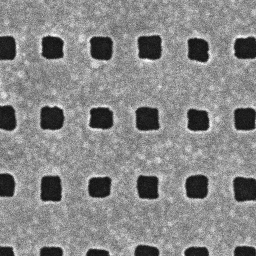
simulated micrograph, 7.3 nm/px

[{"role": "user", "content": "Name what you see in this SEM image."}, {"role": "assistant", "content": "a regular array of holes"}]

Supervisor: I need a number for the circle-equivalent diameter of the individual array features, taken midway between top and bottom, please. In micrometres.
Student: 0.183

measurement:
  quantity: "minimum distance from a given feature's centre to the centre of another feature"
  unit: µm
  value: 0.354